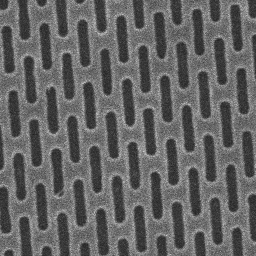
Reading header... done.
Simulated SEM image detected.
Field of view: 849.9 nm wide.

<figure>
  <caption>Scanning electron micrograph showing a regular array of holes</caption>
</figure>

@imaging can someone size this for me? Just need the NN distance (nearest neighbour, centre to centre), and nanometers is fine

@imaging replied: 121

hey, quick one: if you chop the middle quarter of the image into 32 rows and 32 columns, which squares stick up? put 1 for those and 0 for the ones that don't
00111011100011111110011111110001
00111111100011111110001111110001
00111111100011111110001111110001
00011111100011111110001100110001
00011101100011100110001100011001
00011001100011000110001100011001
00011000110011000110001100011111
00011000110011100111111100011111
00111000111111100111111100011111
11111000111111100111111100011111
11111000111111100011111100011101
11111000111111100011001100011000
11111000111001100011000100011000
10011000110001100011000110011000
10001000110001100011000110011100
10011100110001110111000111111100
10001111111001111111000111111100
10001111111000111111000111111100
10001111111000111111000111011100
10001111111000111111000111001100
10001110111000110011000110001100
10001100011000110001000111001100
10001100011000110001100111001111
11001100011101110001111111001111
11001100011111110001111111000111
11111110011111110001111111000111
11111110011111110001111111000110
11111110011111110001110011000110
11111110001100110001110011000110
11100110001100010001110011000110
11000110001100011001110011111110
11000110011100011111110011111110